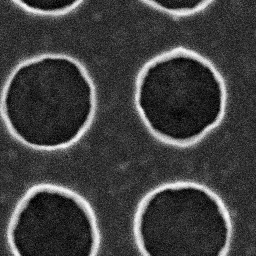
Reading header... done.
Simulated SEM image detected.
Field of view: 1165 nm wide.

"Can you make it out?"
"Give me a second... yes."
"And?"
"holes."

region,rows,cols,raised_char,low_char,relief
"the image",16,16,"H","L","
HHLLHHHHHHLLHHHH
HHHHHHHHHHHHHHHH
HHHHHHHHHHHHHHHH
HHHHHHHHHHHLHHHH
HLLLLHHHHLLLLHHH
LLLLLLHHHLLLLLHH
LLLLLLHHHLLLLLHH
HLLLLLHHHLLLLHHH
HLLLLHHHHHLLHHHH
HHHHHHHHHHHHHHHH
HHHHHHHHHHHHHHHH
HHHHHHHHHHHHHHHH
HHLLLHHHHLLLLHHH
HLLLLLHHHLLLLLHH
HLLLLLHHHLLLLLHH
HLLLLLHHHLLLLLHH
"